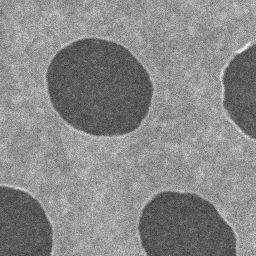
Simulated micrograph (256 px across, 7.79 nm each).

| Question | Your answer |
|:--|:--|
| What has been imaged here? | holes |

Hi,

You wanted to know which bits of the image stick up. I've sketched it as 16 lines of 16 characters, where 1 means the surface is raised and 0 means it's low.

1111111111111111
1111111111111111
1111100111111111
1110000011111110
1110000001111100
1110000000111100
1110000001111100
1111000001111100
1111110111111110
1111111111111111
1111111111111111
1111111111111111
0011111110000111
0001111110000011
0001111110000001
0001111110000001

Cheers